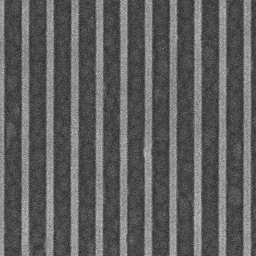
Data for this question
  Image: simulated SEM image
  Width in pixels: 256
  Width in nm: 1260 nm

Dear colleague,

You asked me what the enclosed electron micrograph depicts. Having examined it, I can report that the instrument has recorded parallel lines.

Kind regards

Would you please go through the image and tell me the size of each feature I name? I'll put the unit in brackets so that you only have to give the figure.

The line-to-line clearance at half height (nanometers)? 88.5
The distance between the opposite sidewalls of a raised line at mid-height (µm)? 0.0338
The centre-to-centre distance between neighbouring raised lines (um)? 0.121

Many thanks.